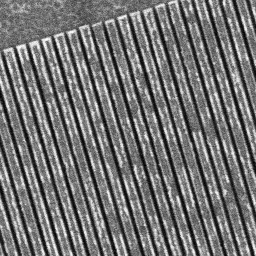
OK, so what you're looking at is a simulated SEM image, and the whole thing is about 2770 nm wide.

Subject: parallel lines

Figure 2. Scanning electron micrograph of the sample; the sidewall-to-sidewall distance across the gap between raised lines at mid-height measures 42.9 nm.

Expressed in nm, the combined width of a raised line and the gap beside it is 142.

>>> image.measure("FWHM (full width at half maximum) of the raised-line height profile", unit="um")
0.0948